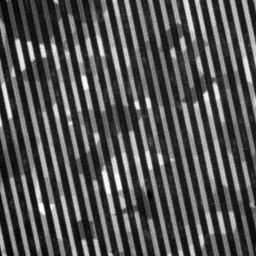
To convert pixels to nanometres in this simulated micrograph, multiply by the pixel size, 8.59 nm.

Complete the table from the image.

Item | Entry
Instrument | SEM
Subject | parallel lines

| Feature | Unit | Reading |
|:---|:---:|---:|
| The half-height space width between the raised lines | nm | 71.4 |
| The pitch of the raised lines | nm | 98.9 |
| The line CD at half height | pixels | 3.29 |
